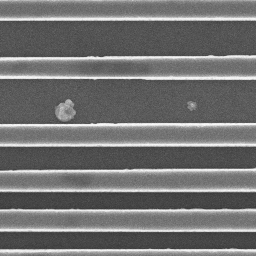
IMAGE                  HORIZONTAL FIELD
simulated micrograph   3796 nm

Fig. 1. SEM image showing lines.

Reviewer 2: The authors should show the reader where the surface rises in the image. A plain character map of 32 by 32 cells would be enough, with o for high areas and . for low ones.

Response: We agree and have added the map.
oooooooooooooooooooooooooooooooo
oooooooooooooooooooooooooooooooo
................................
................................
................................
................................
................................
oooooooooooooooooooooooooooooooo
oooooooooooooooooooooooooooooooo
oooooooooooooooooooooooooooooooo
................................
................................
................................
................................
................................
............oo.ooooooooooooooooo
oooooooooooooooooooooooooooooooo
oooooooooooooooooooooooooooooooo
................................
................................
................................
oooooooooooooooooooooooooooooooo
oooooooooooooooooooooooooooooooo
oooooooooooooooooooooooooooooooo
................................
................................
oooooooooooooooooooooooooooooooo
oooooooooooooooooooooooooooooooo
oooooooooooooooooooooooooooooooo
................................
................................
oooooooooooooooooooooooooooooooo